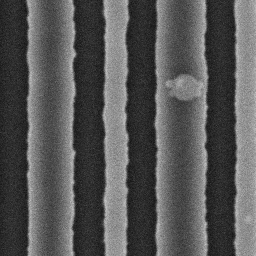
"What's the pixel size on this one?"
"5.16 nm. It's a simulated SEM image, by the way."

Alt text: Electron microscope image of lines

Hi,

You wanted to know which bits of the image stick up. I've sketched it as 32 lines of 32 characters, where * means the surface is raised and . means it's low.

...******....***....******...***
....*****....***....******...***
...******....***....******...***
....*****....***....******....**
....*****....***....******...***
....*****....***....******...***
...******....***....******...***
...******....***....******....**
....*****....***....******....**
....*****....***....******...***
....*****....***....******....**
....*****....***....******...***
...******....***....******...***
...******....***....******...***
....*****....***....******...***
....*****....***...*******...***
....*****....***....******...***
...******....***....******....**
....*****....***....******....**
...******....***....******....**
....*****....***....******....**
...******....***....******...***
...******....***....******...***
....*****....***....******....**
....*****....***....******....**
....*****....***....******...***
....*****....***....******...***
....*****....***....******...***
....*****....***....******...***
....*****....***....******...***
....*****....***....******...***
....*****....***....******...***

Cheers